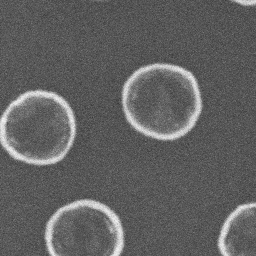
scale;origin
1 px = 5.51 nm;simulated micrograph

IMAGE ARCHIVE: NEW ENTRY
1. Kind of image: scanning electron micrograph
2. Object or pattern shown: raised bodies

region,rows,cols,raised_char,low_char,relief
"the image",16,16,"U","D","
DDDDDDDDDDDDDDDD
DDDDDDDDDDDDDDDD
DDDDDDDDDDDDDDDD
DDDDDDDDDDDDDDDD
DDDDDDDDDUUDDDDD
DDDDDDDDUUUUDDDD
DUUUDDDDUUUUDDDD
UUUUUDDDUUUUDDDD
UUUUUDDDDDUDDDDD
DUUUDDDDDDDDDDDD
DDDDDDDDDDDDDDDD
DDDDDDDDDDDDDDDD
DDDDDDDDDDDDDDDD
DDDUUUUDDDDDDDDU
DDDUUUUDDDDDDDUU
DDDUUUUDDDDDDDUU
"